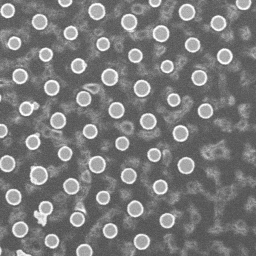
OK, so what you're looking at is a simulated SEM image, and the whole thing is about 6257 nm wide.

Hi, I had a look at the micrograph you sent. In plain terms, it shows a regular array of raised bodies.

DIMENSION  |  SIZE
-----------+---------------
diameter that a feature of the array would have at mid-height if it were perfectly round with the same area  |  14 pixels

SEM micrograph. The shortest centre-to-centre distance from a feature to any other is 811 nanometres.